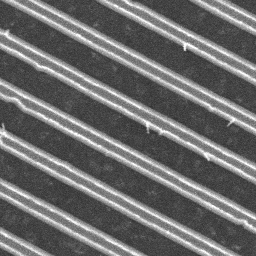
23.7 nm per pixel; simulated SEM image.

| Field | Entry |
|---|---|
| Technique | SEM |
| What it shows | parallel lines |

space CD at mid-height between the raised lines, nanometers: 699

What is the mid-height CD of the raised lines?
348 nm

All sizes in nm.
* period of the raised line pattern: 1040